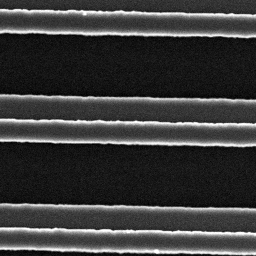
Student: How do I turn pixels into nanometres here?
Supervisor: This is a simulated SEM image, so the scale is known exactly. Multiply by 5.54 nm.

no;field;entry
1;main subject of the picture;lines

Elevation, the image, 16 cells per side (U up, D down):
UUUUUUUUUUUUUUUU
UUUUUUUUUUUUUUUU
DDDDDDDDDDDDDDDD
DDDDDDDDDDDDDDDD
DDDDDDDDDDDDDDDD
DDDDDDDDDDDDDDDD
UUUUUUUUUUUUUUUU
UUUUUUUUUUUUUUUU
UUUUUUUUUUUUUUUU
DDDDDDDDDDDDDDDD
DDDDDDDDDDDDDDDD
DDDDDDDDDDDDDDDD
DDDDDDDDDDDDDDDD
UUUUUUUUUUUUUUUU
UUUUUUUUUUUUUUUU
UUUUUUUUUUUUUUUU